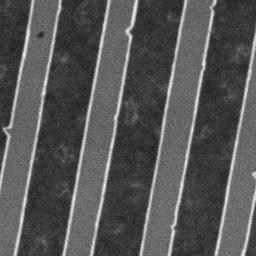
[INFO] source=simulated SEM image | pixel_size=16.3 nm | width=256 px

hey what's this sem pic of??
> one or a few lines or trenches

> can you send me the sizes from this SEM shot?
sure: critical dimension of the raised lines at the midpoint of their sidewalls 771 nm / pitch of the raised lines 1230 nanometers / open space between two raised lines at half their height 449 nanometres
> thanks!